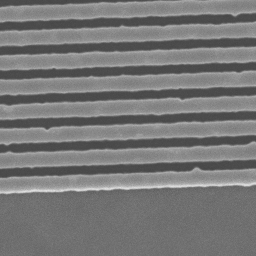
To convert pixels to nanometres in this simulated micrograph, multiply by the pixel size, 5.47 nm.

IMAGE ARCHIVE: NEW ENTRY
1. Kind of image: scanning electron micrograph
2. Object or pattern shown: parallel lines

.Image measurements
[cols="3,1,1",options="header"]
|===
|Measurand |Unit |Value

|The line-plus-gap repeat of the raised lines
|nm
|134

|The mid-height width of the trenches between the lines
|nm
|54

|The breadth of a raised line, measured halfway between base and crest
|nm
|81.3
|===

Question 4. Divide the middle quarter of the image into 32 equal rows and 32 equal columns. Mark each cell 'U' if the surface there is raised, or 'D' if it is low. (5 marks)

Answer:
UUUUUUUUUUUUUUDDDDDDDDDDDDDDDDDD
DDDDDDDDDDDDDDDDDDDDDDDDDDDDDDDD
DDDDDDDDDDDDDDDDDDDDDDDDDDDUDUUU
UUUUUUUUUUUUUUUUUUUUUUUUUUUUUUUU
UUUUUUUUUUUUUUUUUUUUUUUUUUUUUUUU
UUUUUUUUUUUUUUUUUUUUUUUUUUUUUUUU
UUUUUUUUUUUUUUUUUUUUDDDDDDDDDDDD
DDDDDDDDDDDDDDDDDDDDDDDDDDDDDDDD
DDDDDDDDDDDDDDDDDDDDDDDDDDUDDDDD
DDDDDUUUUUUUUUUUUUUUUUUUUUUUUUUU
UUUUUUUUUUUUUUUUUUUUUUUUUUUUUUUU
UUUUUUUUUUUUUUUUUUUUUUUUUUUUUUUU
UUUUUUUUUUUUUUUUUUDDUDUUUDDDDDDD
DDDDDDDDDDDDDDDDDDDDDDDDDDDDDDDD
DDDDDDDDDDDDDDDDDDDDDDDDDDDDDDDD
DDDDDDUDDDUUUUUUUUUUUUUUUUUUUUUU
UUUUUUUUUUUUUUUUUUUUUUUUUUUUUUUU
UUUUUUUUUUUUUUUUUUUUUUUUUUUUUUUU
UUUUUUUUUUUUUUUUUUUUUUUUDDDDDDDD
DDDDDDDDDDDDDDDDDDDDDDDDDDDDDDDD
DDDDDDDDDDDDDDDDDDDDDDDDDDDDDDDD
DDDDDDDDDUUUUUDUUUUUUUUUUUUUUUUU
UUUUUUUUUUUUUUUUUUUUUUUUUUUUUUUU
UUUUUUUUUUUUUUUUUUUUUUUUUUUUUUUU
UUUUUUUUUUUUUUUUUUUUUUUDDDUDDUDD
DDDDDDDDDDDDDDDDDDDDDDDDDDDDDDDD
DDDDDDDDDDDDDDDDDDDDDDDDDDDDDDDD
DDDDDDDDDDDDDDDUUUUUUUUUUUUUUUUU
UUUUUUUUUUUUUUUUUUUUUUUUUUUUUUUU
UUUUUUUUUUUUUUUUUUUUUUUUUUUUUUUU
UUUUUUUUUUUUUUUUUUUUUUUUUUUUUUDD
DDDDDDDDDDDDDDDDDDDDDDDDDDDDDDDD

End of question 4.